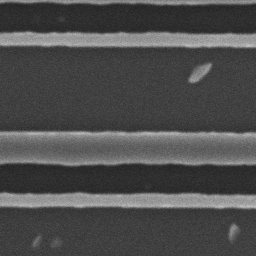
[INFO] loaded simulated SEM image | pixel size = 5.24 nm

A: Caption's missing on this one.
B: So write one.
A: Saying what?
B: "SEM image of lines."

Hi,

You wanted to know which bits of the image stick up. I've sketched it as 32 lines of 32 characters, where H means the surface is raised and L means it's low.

LLLLLLLLLLLLLLLLLLLHHHHHHHLLLLLL
LLLLLLLLLLLLLLLLLLLLLLLLLLLLLLLL
LLLLLLLLLLLLLLLLLLLLLLLLLLLLLLLL
LLLLLLLLLLLLLLLLLLLLLLLLLLLLLLLL
HHHHHHHHHHHHHHHHHHHHHHHHHHHHHHHH
HHHHHHHHHHHHHHHHHHHHHHHHHHHHHHHH
LLLLLLLLLLLLLLLLLLLLLLLLLLLLLLLL
LLLLLLLLLLLLLLLLLLLLLLLLLLLLLLLL
LLLLLLLLLLLLLLLLLLLLLLLLLLLLLLLL
LLLLLLLLLLLLLLLLLLLLLLLLLLLLLLLL
LLLLLLLLLLLLLLLLLLLLLLLLLLLLLLLL
LLLLLLLLLLLLLLLLLLLLLLLLLLLLLLLL
LLLLLLLLLLLLLLLLLLLLLLLLLLLLLLLL
LLLLLLLLLLLLLLLLLLLLLLLLLLLLLLLL
LLLLLLLLLLLLLLLLLLLLLLLLLLLLLLLL
LLLLLLLLLLLLLLLLLLLLLLLLLLLLLLLL
LLLLLLLLLLLLLLLLLLLLLLLLLLLLLLLL
HHHHHHHHHHHHHHHHHHHHHHHHHHHHHHHH
HHHHHHHHHHHHHHHHHHHHHHHHHHHHHHHH
HHHHHHHHHHHHHHHHHHHHHHHHHHHHHHHH
LLLLLLLHHHHHLHHLLLLLLLLHHLHHHHHH
LLLLLLLLLLLLLLLLLLLLLLLLLLLLLLLL
LLLLLLLLLLLLLLLLLLLLLLLLLLLLLLLL
LLLLLLLLLLLLLLLLLLLLLLLLLLLLLLLL
HHHHHHHHHHHHHHHHHHHHHHHHHHHHHHHH
HHHHHHHHHHHHHHHHHHHHHHHHHHHHHHHH
LLLLLLLLLLLLLLLLLLLLLLLLLLLLLLLL
LLLLLLLLLLLLLLLLLLLLLLLLLLLLLLLL
LLLLLLLLLLLLLLLLLLLLLLLLLLLLLLLL
LLLLLLLLLLLLLLLLLLLLLLLLLLLLLLLL
LLLLLLLLLLLLLLLLLLLLLLLLLLLLLLLL
LLLLLLLLLLLLLLLLLLLLLLLLLLLLLLLL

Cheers